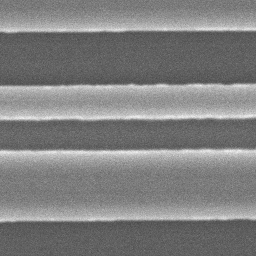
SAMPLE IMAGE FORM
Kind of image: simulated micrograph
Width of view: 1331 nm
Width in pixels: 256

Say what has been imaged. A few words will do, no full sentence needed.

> lines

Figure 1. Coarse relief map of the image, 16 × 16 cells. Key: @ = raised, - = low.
@@@@@@@@@@@@@@@@
@@@@@@@@@@@@@@@@
----------------
----------------
----------------
@@@@@@@@@@@@@@@@
@@@@@@@@@@@@@@@@
@@@@@@@@@@@@@@@@
@@@@@@@@@@@@@@@@
@@@@@@@@@@@@@@@@
@@@@@@@@@@@@@@@@
@@@@@@@@@@@@@@@@
@@@@@@@@@@@@@@@@
@@@@@@@@@@@@@@@@
----------------
----------------